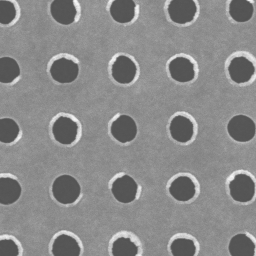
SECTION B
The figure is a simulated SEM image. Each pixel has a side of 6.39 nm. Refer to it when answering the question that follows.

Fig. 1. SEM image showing a regular array of holes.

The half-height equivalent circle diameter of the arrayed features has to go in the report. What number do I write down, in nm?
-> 169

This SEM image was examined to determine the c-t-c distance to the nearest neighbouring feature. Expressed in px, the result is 58.1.